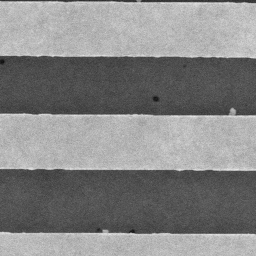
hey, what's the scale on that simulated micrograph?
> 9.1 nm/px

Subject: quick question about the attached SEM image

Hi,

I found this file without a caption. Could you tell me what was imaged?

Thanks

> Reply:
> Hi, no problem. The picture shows lines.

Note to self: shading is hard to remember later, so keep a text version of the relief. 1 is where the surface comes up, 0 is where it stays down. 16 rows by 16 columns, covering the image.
1111111111111111
1111111111111111
1111111111111111
0000000001011111
0000000000000000
0000000000000000
0000000000000000
1111111111111111
1111111111111111
1111111111111111
1111111111111111
0000000000000000
0000000000000000
0000000000000000
0000000000000000
1111111111111111